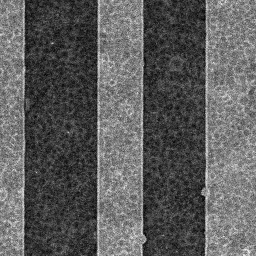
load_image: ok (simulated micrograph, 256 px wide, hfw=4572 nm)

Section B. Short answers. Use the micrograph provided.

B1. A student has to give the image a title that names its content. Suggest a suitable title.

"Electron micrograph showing one or a few lines or trenches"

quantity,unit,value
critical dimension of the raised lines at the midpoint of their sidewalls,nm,790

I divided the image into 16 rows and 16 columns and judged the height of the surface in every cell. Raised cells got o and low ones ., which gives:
o.....ooo....ooo
oo....ooo....ooo
o.....ooo....ooo
o.....ooo....ooo
oo....ooo....ooo
o.....ooo....ooo
oo....ooo....ooo
o.....ooo....ooo
oo....ooo....ooo
oo....ooo....ooo
oo....ooo....ooo
oo....ooo....ooo
o.....ooo....ooo
o.....ooo....ooo
o.....ooo....ooo
o.....ooo....ooo